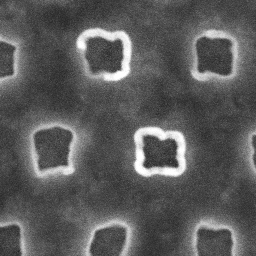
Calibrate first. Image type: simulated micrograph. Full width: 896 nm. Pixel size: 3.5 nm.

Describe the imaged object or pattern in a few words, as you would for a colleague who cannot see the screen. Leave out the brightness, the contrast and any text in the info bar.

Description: holes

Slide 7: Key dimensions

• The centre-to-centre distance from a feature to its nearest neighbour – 372 nanometers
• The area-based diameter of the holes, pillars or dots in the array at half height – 0.141 um